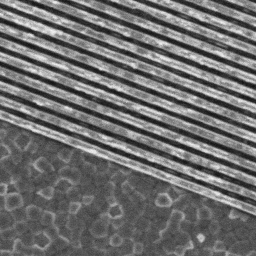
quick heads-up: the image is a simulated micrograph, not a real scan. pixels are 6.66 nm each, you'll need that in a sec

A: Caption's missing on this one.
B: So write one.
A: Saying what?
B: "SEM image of parallel lines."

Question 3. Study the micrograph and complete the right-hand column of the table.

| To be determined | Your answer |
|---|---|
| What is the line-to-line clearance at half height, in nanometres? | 44.4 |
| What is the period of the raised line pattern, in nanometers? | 90.6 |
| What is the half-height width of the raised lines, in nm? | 44.4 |